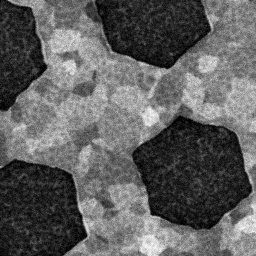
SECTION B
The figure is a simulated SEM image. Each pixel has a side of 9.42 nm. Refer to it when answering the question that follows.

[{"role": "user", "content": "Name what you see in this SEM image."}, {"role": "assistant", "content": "holes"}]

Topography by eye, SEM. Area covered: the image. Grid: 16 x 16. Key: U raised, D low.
DDUUUUDDDDDDDUUU
DDUUUUDDDDDDDUUU
DDDUUUUDDDDDDUUU
DDDUUUUUDDDUUUUU
DDDUUUUUUUUUUUUU
DDUUUUUUUUUUUUUU
DUUUUUUUUUUUUUUU
UUUUUUUUUUUDUUUU
UUUUUUUUUUDDDDDU
UUUUUUUUDDDDDDDU
DDDDUUUUUDDDDDDU
DDDDDUUUUDDDDDDD
DDDDDUUUUDDDDDDU
DDDDDUUUUUDDDDUU
DDDDDUUUUUUUUUUU
DDDDDUUUUUUUUUUU